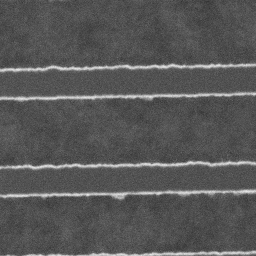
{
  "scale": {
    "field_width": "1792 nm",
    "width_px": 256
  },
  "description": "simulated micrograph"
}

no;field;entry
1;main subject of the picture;lines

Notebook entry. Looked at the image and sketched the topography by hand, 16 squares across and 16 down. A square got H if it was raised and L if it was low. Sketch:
LLLLLLLLLLLLLLLL
LLLLLLLLLLLLLLLL
LLLLLLLLLLLLLLLL
LLLLLLLLLLLLLLLL
HHHHHHHHHHHHHHHH
HHHHHHHHHHHHHHHH
LLLLLLLLLLLLLLLL
LLLLLLLLLLLLLLLL
LLLLLLLLLLLLLLLL
LLLLLLLLLLLLLLLL
HHHHHHHHHHHHHHHH
HHHHHHHHHHHHHHHH
LLLLLLLLLLLLLLLL
LLLLLLLLLLLLLLLL
LLLLLLLLLLLLLLLL
LLLLLLLLLLLLLLLL